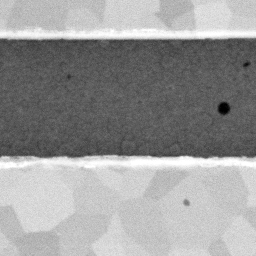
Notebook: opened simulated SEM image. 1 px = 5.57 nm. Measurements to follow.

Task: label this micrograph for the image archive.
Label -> one or a few lines or trenches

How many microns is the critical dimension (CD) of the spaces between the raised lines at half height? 0.706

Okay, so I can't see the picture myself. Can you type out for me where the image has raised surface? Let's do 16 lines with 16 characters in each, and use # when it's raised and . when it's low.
################
################
................
................
................
................
................
................
................
................
################
################
################
################
################
################